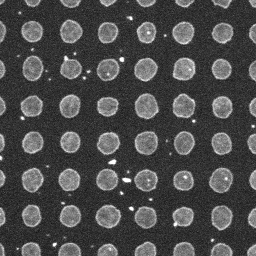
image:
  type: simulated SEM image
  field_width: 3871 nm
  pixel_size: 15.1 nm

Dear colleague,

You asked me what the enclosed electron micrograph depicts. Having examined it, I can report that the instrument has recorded a regular array of raised bodies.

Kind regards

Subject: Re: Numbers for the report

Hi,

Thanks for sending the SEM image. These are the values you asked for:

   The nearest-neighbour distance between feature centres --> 552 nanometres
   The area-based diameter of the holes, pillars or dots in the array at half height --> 20.9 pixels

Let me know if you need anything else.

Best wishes